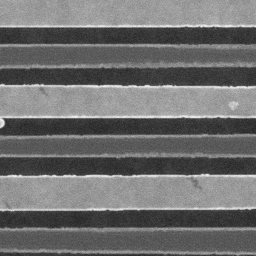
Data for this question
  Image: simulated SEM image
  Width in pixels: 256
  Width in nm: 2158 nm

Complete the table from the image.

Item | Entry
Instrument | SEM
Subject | lines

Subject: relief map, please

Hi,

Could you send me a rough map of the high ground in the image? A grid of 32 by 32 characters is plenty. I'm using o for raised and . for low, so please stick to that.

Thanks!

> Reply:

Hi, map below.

oooooooooooooooooooooooooooooooo
oooooooooooooooooooooooooooooooo
oooooooooooooooooooooooooooooooo
................................
................................
................................
oooooooooooooooooooooooooooooooo
oooooooooooooooooooooooooooooooo
................................
................................
................................
oooooooooooooooooooooooooooooooo
oooooooooooooooooooooooooooooooo
oooooooooooooooooooooooooooooooo
oooooooooooooooooooooooooooooooo
................................
................................
oooooooooooooooooooooooooooooooo
oooooooooooooooooooooooooooooooo
.....o.oooo.....................
................................
................................
oooooooooooooooooooooooooooooooo
oooooooooooooooooooooooooooooooo
oooooooooooooooooooooooooooooooo
oooooooooooooooooooooooooooooooo
................................
................................
................................
oooooooooooooooooooooooooooooooo
oooooooooooooooooooooooooooooooo
..........oooooooooooooooooooooo